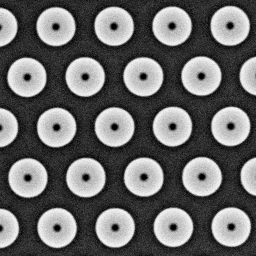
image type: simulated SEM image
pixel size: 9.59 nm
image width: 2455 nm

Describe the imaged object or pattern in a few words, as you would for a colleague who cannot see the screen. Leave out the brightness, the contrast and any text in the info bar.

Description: an array of small figures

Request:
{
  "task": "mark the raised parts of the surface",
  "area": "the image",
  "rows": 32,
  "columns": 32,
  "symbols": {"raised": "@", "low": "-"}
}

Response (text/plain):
--------------------------------
@----@@@@----@@@----@@@----@@@--
@@---@@@@---@@@@@--@@@@@--@@@@@-
@@---@@@@---@@@@@--@@@@@--@@@@@-
@@---@@@@---@@@@---@@@@@---@@@@-
@-----@@-----@@------@------@@--
--------------------------------
--@@------@@-----@@-----@@-----@
-@@@@----@@@@---@@@@---@@@@---@@
-@@@@@--@@@@@--@@@@@---@@@@@--@@
-@@@@@--@@@@@---@@@@---@@@@---@@
--@@@----@@@-----@@-----@@-----@
--------------------------------
---------------------@------@@--
@@---@@@@---@@@@----@@@@---@@@@-
@@---@@@@---@@@@@--@@@@@---@@@@-
@@---@@@@---@@@@@--@@@@@---@@@@-
@@---@@@@----@@@----@@@----@@@--
--------------------------------
--------------------------------
--@@@----@@@----@@@@---@@@@----@
-@@@@@--@@@@@---@@@@---@@@@@--@@
-@@@@@--@@@@@---@@@@---@@@@@--@@
-@@@@@---@@@@---@@@@---@@@@----@
---@------@@--------------------
--------------------------------
@-----@@@----@@@----@@@----@@@--
@@---@@@@---@@@@@--@@@@@---@@@@-
@@---@@@@@--@@@@@--@@@@@---@@@@-
@@---@@@@---@@@@@---@@@@---@@@@-
@-----@@-----@@@----@@@-----@@--
--------------------------------